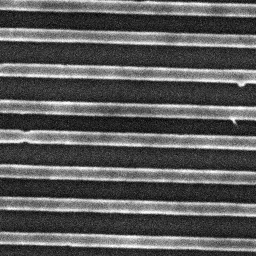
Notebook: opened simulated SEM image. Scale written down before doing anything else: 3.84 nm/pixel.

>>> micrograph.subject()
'parallel lines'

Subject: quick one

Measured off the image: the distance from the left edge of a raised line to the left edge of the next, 129 nanometres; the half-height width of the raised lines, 45.1 nm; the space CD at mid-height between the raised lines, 0.0874 µm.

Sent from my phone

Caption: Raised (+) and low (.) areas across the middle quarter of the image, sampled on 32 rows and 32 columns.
................................
++++++++++++++++++++++++++++++++
++++++++++++++++++++++++++++++++
...............+++++++++++++++++
................................
................................
................................
................................
................................
................................
+++++++++++++++++++++++++++++++.
++++++++++++++++++++++++++++++++
++++++++++++++++++++++++++++++++
................................
................................
................................
................................
++++++++++++++++++..............
++++++++++++++++++++++++++++++++
++++++++++++++++++++++++++++++++
.....................+++++++++++
................................
................................
................................
................................
................................
++++++++++++++++++++++++........
++++++++++++++++++++++++++++++++
++++++++++++++++++++++++++++++++
.............................+++
................................
................................